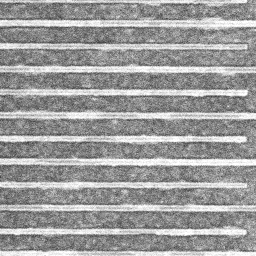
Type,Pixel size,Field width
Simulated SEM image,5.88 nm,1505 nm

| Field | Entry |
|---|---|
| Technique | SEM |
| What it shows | parallel lines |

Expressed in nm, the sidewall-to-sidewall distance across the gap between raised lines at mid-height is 109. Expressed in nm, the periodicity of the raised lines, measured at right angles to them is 136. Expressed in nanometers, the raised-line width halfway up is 25.7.